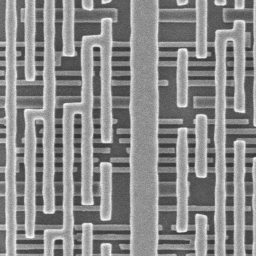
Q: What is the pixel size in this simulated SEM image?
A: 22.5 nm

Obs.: wiring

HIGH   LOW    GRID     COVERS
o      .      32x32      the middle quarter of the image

....ooo..ooo.....oooooo.....ooo.
....ooo..ooo.....oooooo.....ooo.
....ooo..ooo.....oooooo.....ooo.
.....oo..ooo.....oooooo.....ooo.
.....oo..ooo.....oooooo.....ooo.
....ooo...oo.....oooooo.....ooo.
....ooo..ooo.....ooooooo....ooo.
....ooo..ooo.....ooooooo....ooo.
....ooo..ooo.....ooooooo....ooo.
....ooo..ooo.....ooooooo....ooo.
ooooooo..ooo....oooooooo.....o..
ooooooo..ooo....oooooooo........
ooo.ooo..ooo.....ooooooo........
oo..ooo..ooo.....ooooooo........
oo..ooo..ooo.....oooooo.........
oo..ooo..ooo.....oooooo.........
oo..ooo..ooo.....oooooo......oo.
oo..ooo..ooo.....oooooo......oo.
oo..ooo...oo.....oooooo.....ooo.
oo..ooo...o......oooooo.....ooo.
oo..ooo..........ooooooo....ooo.
oo..ooo..........ooooooo....ooo.
oo..ooo..........ooooooo....ooo.
oo..ooo..........oooooo.....ooo.
oo..ooo..........oooooo.....ooo.
oo..ooo..ooo.....oooooo.....ooo.
oo..ooo..ooo.....oooooo.....ooo.
oo..ooo..ooo.....oooooo.....ooo.
oo..ooo..ooo.....oooooo.....ooo.
oo..ooo..ooo.....ooooooo....ooo.
oo..ooo..ooo.....ooooooo....ooo.
oo..ooo..ooo.....ooooooo....ooo.